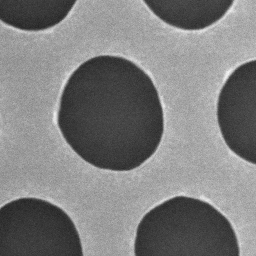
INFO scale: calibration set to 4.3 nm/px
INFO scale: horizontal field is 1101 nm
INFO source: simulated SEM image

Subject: holes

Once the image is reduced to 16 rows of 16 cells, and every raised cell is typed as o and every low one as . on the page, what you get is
....ooooo.....oo
....oooooo...ooo
oooooooooooooooo
oooooo.ooooooooo
ooooo....oooooo.
oooo......oooo..
oooo......oooo..
oooo......oooo..
oooo......oooo..
ooooo.....ooooo.
oooooo...ooooooo
oooooooooooooooo
o..ooooooo...ooo
....ooooo.....oo
.....oooo......o
.....ooo.......o